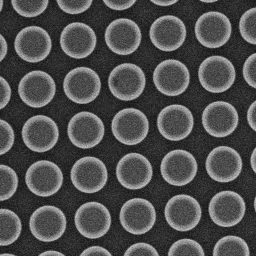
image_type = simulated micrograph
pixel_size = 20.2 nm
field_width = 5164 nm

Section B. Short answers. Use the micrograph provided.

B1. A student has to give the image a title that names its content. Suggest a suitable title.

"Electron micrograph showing an array of small figures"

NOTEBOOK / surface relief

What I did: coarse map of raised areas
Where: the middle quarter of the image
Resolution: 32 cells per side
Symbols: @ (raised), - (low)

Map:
-------------@@@@@-----@@@@@@@--
--@@@@@-----@@@@@@@----@@@@@@@@-
-@@@@@@@----@@@@@@@@--@@@@@@@@@-
@@@@@@@@@--@@@@@@@@@--@@@@@@@@@-
@@@@@@@@@--@@@@@@@@@---@@@@@@@@-
@@@@@@@@@--@@@@@@@@@---@@@@@@@@-
@@@@@@@@@---@@@@@@@@----@@@@@@--
-@@@@@@@@---@@@@@@@------@@@@---
-@@@@@@@------@@@@--------------
---@@@--------------------------
--------------------------@@@@--
---------------@@@-------@@@@@@-
---@@@@------@@@@@@@----@@@@@@@@
--@@@@@@@---@@@@@@@@@--@@@@@@@@@
-@@@@@@@@---@@@@@@@@@--@@@@@@@@@
-@@@@@@@@@--@@@@@@@@@--@@@@@@@@@
-@@@@@@@@@--@@@@@@@@@---@@@@@@@@
-@@@@@@@@@--@@@@@@@@@---@@@@@@@-
-@@@@@@@@----@@@@@@@------@@@@--
--@@@@@@@-----@@@@@-------------
---@@@@@------------------------
--------------------------------
----------------@@--------@@@@@@
-----@@@-------@@@@@-----@@@@@@@
---@@@@@@-----@@@@@@@---@@@@@@@@
--@@@@@@@@---@@@@@@@@@--@@@@@@@@
--@@@@@@@@@--@@@@@@@@@--@@@@@@@@
--@@@@@@@@@--@@@@@@@@@--@@@@@@@@
--@@@@@@@@@--@@@@@@@@@---@@@@@@@
--@@@@@@@@----@@@@@@@-----@@@@@-
---@@@@@@@-----@@@@@------------
----@@@@@-----------------------